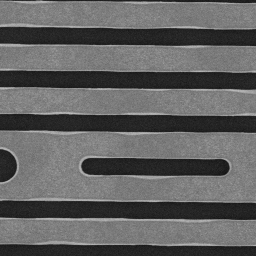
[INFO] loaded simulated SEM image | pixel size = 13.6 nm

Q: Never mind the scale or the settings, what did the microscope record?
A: groups of lines, slits or small figures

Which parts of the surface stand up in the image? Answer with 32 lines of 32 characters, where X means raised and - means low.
XXXXXXXXXXXXXXXXXXXXXXXXXXXXXXXX
XXXXXXXXXXXXXXXXXXXXXXXXXXXXXXXX
XXXXXXXXXXXXXXXXXXXXXXXXXXXXXXXX
-------------------------XXXXXXX
--------------------------------
--------------------------------
XXXXXXXXXXXXXXXXXXXXXXXXXXXXXXXX
XXXXXXXXXXXXXXXXXXXXXXXXXXXXXXXX
XXXXXXXXXXXXXXXXXXXXXXXXXXXXXXXX
--------------------------------
--------------------------------
XXXXXXXXXXXXXXXXXXXXXXXXXXXXXXX-
XXXXXXXXXXXXXXXXXXXXXXXXXXXXXXXX
XXXXXXXXXXXXXXXXXXXXXXXXXXXXXXXX
--------------------------------
--------------------------------
XXXXXX--------------------------
XXXXXXXXXXXXXXXXXXXXXXXXXXXXXXXX
XXXXXXXXXXXXXXXXXXXXXXXXXXXXXXXX
--XXXXXXXXXXXXXXXXXXXXXXXXXXXXXX
--XXXXXXXX-------------------XXX
--XXXXXXXX-------------------XXX
-XXXXXXXXXXXXXXXXXXXXXXXXXXXXXXX
XXXXXXXXXXXXXXXXXXXXXXXXXXXXXXXX
XXXXXXXXXXXXXXXXXXXXXXXXXXXXXXXX
--------------------------------
--------------------------------
XXXXXXXX------------------------
XXXXXXXXXXXXXXXXXXXXXXXXXXXXXXXX
XXXXXXXXXXXXXXXXXXXXXXXXXXXXXXXX
---XX-----XXXXXXXXXXXXXXXXXXXXXX
--------------------------------